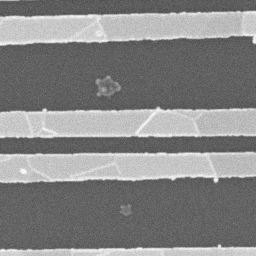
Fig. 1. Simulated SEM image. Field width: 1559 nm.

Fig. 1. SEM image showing lines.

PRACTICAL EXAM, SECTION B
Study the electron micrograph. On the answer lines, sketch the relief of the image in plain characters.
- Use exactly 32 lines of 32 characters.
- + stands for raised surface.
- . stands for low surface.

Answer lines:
................................
...............................+
++++++++++++++++++++++++++++++++
++++++++++++++++++++++++++++++++
+++++++++++++++++++++++++++++..+
+...............................
................................
................................
................................
................................
.............+..................
.............+..................
................................
................................
++++++++++++++++++++++++++++++++
++++++++++++++++++++++++++++++++
++++++++++++++++++++++++++++++++
................................
................................
++++++++++++++++++++++++++++++++
++++++++++++++++++++++++++++++++
++++++++++++++++++++++++++++++++
++++++++++......................
................................
................................
................................
................................
................................
................................
................................
................................
++++++++++++++++++++++++++++++++